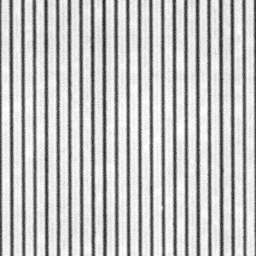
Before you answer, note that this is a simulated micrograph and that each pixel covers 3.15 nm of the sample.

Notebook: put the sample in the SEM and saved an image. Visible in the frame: parallel lines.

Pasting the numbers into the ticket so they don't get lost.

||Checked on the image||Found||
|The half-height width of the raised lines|22.4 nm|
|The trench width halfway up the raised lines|4.51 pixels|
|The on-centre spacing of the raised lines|0.0367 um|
